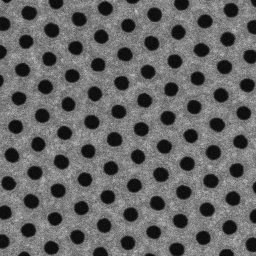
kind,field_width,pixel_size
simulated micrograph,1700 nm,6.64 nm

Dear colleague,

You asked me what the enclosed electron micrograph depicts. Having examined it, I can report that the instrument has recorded a regular array of holes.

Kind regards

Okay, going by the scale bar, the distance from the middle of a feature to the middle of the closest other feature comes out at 28.3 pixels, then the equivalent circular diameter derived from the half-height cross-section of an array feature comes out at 92.1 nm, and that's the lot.